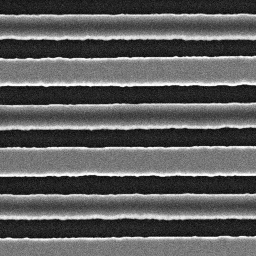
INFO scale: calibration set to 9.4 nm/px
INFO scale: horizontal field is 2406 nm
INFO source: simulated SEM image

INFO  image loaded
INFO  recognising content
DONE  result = lines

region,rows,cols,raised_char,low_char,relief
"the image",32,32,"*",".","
................................
................................
********************************
********************************
********************************
................................
................................
********************************
********************************
********************************
********************************
................................
................................
********************************
********************************
********************************
................................
................................
.***..*****..*******************
********************************
********************************
********************************
................................
................................
********************************
********************************
********************************
................................
................................
................................
********************************
********************************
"